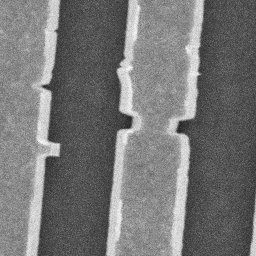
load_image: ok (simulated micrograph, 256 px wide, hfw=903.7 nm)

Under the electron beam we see one or a few lines or trenches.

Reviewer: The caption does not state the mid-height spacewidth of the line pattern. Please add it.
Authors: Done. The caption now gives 274 nm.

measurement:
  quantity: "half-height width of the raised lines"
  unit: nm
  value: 231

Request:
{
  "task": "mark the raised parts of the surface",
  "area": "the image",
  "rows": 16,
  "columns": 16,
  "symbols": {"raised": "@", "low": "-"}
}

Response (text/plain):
@@@-----@@@@----
@@@-----@@@@----
@@@-----@@@@----
@@@-----@@@@----
@@@-----@@@@----
@@@-----@@@@----
@@@-----@@@@----
@@@-----@@@-----
@@@-----@@@-----
@@@----@@@@@----
@@@----@@@@@----
@@-----@@@@-----
@@-----@@@@-----
@@-----@@@@-----
@@-----@@@@-----
@@-----@@@@-----